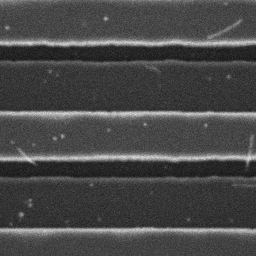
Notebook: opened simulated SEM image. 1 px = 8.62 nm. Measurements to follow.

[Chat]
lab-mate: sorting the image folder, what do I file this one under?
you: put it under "lines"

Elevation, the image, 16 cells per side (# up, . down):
################
################
################
................
................
................
................
################
################
################
................
................
................
................
################
################